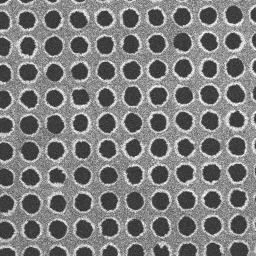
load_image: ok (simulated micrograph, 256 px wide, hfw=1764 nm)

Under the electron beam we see a regular array of holes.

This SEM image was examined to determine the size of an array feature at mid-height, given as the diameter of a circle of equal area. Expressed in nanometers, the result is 122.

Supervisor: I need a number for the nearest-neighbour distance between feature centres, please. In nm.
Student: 176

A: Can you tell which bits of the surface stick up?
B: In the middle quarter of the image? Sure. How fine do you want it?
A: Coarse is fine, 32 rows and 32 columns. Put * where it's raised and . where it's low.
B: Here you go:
***..****...***....**....***....
**....**.....**....**....***....
**....**.....**....**....***...*
**...****...****..**************
********************************
********************************
***..****..****....***...***....
**....***...***....**.....**....
**....***....**....***....**....
**....***...***....***...***...*
**********..*****.**************
********************************
**********..****..*****.****...*
***...***....**....***...***....
**....***....**.....*.....**....
**....***....**....***....***...
***..****...****...****..*****.*
********************************
********************************
***...****..****...***....***...
***....**....**....***....**....
***....**....**....***....**....
***....**....***...***...****...
****..****.*********************
********************************
************************.****..*
***...****...***...***....**....
**.....**....***....**....**....
**.....**....***....**....**....
***...****...***...***...****.**
********************************
********************************